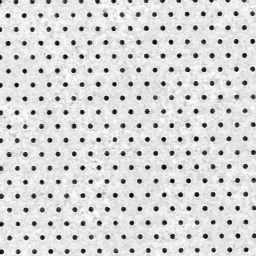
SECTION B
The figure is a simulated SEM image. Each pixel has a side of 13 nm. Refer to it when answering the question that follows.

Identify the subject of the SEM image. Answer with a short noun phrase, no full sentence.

a regular array of holes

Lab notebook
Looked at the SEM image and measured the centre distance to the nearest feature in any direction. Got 206 nanometres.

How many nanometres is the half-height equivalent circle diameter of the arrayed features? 73.4